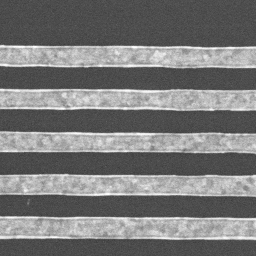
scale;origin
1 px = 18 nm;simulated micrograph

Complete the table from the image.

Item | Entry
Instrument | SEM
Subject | wiring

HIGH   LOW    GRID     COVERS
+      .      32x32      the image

................................
................................
................................
................................
................................
................................
++++++++++++++++++++++++++++++++
++++++++++++++++++++++++++++++++
................................
................................
................................
++++++++++++++++++++++++++++++++
++++++++++++++++++++++++++++++++
.......++.......+..+++++++++++++
................................
................................
................................
++++++++++++++++++++++++++++++++
++++++++++++++++++++++++++++++++
................................
................................
................................
++++++++++++++++++++++++++++++++
++++++++++++++++++++++++++++++++
................................
................................
................................
++++++++++++++++++++++++++++++++
++++++++++++++++++++++++++++++++
++++++++++++++++++++++++++++++++
................................
................................